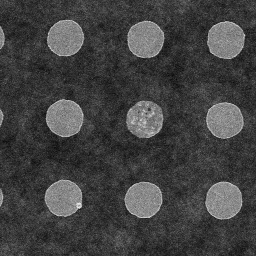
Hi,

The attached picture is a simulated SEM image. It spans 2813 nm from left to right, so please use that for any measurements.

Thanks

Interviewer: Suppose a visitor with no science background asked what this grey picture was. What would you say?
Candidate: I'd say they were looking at a regular array of raised bodies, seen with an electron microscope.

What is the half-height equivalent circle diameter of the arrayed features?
403 nm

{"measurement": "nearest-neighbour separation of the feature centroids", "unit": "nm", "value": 880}